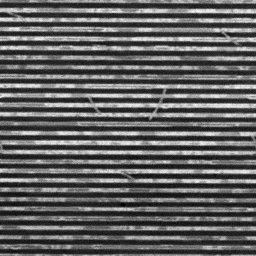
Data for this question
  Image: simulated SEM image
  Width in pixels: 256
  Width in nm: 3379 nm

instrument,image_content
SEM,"parallel lines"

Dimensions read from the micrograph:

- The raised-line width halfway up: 37.9 nm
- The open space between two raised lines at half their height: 89.1 nm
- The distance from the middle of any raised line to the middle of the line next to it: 0.125 micrometres